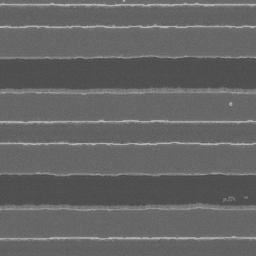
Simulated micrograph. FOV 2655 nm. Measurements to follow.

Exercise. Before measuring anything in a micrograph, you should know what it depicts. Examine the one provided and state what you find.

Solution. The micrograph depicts lines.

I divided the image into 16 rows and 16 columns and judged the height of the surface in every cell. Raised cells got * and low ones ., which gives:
****************
****************
****************
****************
................
................
****************
****************
****************
****************
****************
................
................
****************
****************
****************